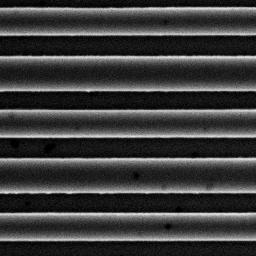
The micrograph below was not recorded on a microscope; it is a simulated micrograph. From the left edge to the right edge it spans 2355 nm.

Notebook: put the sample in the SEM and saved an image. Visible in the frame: lines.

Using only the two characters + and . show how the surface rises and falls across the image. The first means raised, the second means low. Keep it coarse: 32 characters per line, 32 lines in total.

................................
++++++++++++++++++++++++++++++++
++++++++++++++++++++++++++++++++
++++++++++++++++++++++++++++++++
................................
................................
................................
++++++++++++++++++++++++++++++++
++++++++++++++++++++++++++++++++
++++++++++++++++++++++++++++++++
++++++++++++++++++++++++++++++++
................................
................................
................................
++++++++++++++++++++++++++++++++
++++++++++++++++++++++++++++++++
++++++++++++++++++++++++++++++++
................................
................................
................................
++++++++++++++++++++++++++++++++
++++++++++++++++++++++++++++++++
++++++++++++++++++++++++++++++++
++++++++++++++++++++++++++++++++
................................
................................
................................
++++++++++++++++++++++++++++++++
++++++++++++++++++++++++++++++++
++++++++++++++++++++++++++++++++
................................
................................